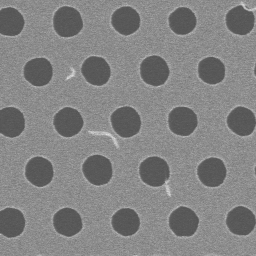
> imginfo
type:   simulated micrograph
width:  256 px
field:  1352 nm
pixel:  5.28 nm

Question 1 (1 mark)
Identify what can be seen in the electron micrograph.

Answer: a regular array of holes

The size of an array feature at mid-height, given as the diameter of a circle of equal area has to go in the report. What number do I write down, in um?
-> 0.155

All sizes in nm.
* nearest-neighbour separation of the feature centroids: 300